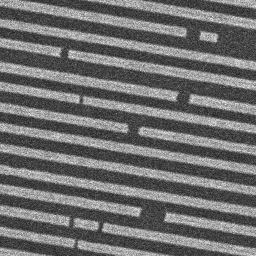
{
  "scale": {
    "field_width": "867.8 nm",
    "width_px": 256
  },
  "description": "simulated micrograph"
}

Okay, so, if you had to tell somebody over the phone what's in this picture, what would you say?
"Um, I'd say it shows parallel lines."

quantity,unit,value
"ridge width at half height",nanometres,28.3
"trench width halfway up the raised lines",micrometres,0.0409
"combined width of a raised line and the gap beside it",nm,69.7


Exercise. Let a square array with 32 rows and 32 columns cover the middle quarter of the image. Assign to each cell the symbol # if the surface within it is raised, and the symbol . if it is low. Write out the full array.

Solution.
.............###########........
...................###########..
##......................########
######........................##
#############...................
......#############.............
............#############.......
##................##########....
####.###................####....
..##.#########.................#
........###########.............
..............###########.......
#..................############.
#####....................#######
############...................#
.....###########................
...........#####...#####........
...................###########..
#######................#########
.############................###
.......############.............
.............###########........
...................###########..
######..................########
############..................##
......###########...............
............###########.........
.................############...
###....................#########
#########....................###
...############.................
.........###########............